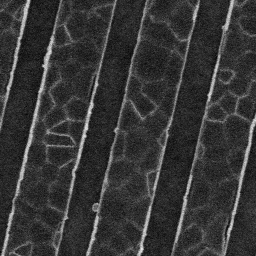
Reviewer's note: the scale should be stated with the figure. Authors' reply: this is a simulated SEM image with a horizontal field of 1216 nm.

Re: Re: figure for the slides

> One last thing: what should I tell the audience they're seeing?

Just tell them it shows one or a few lines or trenches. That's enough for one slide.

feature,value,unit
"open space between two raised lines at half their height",140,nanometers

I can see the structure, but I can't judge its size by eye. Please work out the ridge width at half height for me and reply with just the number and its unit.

0.248 um